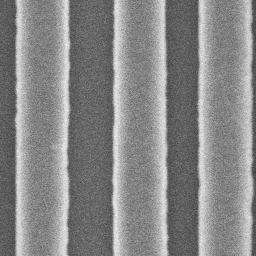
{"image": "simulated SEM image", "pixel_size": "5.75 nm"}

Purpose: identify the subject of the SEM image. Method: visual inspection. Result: lines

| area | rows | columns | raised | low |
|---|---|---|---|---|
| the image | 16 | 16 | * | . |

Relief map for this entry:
.***...***..****
.***...***...***
.***...***..****
.***...***..****
.***...***...***
.***...***..****
.***...***..****
.***...***..****
.***...***..****
.***...***..****
.***...***..****
.***...***...***
.***...***..****
.***...***..****
.***...***..****
.***...***..****